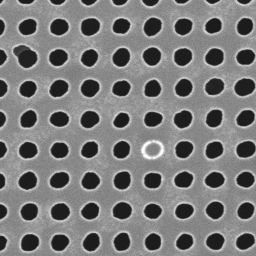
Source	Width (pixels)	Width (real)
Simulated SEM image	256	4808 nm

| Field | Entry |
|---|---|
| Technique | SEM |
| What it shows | a regular array of holes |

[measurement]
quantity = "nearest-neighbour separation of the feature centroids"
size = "567 nm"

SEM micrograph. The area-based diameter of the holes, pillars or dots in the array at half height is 333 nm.